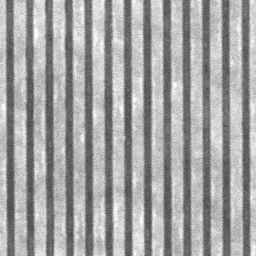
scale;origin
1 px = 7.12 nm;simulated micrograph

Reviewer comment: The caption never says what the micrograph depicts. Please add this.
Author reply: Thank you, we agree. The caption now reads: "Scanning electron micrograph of parallel lines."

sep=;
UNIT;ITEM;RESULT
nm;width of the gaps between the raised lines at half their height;65.9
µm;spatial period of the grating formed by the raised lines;0.14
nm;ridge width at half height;73.9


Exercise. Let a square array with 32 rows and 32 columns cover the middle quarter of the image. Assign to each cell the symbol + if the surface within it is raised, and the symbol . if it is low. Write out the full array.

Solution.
...++..+++..+++..+++..++...++...
...++..+++..+++..+++..++...++...
...++..+++..+++..+++..++...++...
...++..+++..+++..+++..++...++...
...++..+++..+++..+++..++...++...
...++..+++..+++..+++..+++..++...
...++..+++..+++..+++..++...++...
...++..+++..+++..+++..++...++...
...++..+++..+++..+++..++...++...
...++..+++..+++..+++..++...++...
...++..+++..+++..+++..++...++...
...++..+++..+++..+++..++...++...
...++..+++..+++..+++..++...++...
...++..+++..+++..+++..+++..++...
...++..+++..+++..+++..+++..++...
...++..+++..+++..+++..+++..++...
...++..+++..+++..+++..+++..++...
...++..+++..+++..+++..+++..++...
...++..+++..+++..+++..+++..++...
...++..+++..+++..+++..+++..++...
...++..+++..+++..+++..+++..++...
...++..+++..+++..+++..+++..++...
...++...++..+++..+++..+++..++...
...++...++..+++..+++..+++..++...
...++...++..+++..+++..+++..++...
...++...++..+++..+++..+++..++...
...++...++..+++..+++..+++..++...
...++...++..+++..+++..+++..++...
...++...++..+++..+++..+++..++...
...++...++..+++..+++..+++..++...
...++...++..+++..+++..+++..++...
...++...++..+++..+++..+++..++...